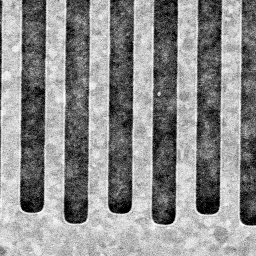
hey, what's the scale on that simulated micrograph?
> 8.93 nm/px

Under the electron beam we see groups of lines, slits or small figures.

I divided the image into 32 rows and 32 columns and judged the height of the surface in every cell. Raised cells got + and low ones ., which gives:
+++...++...+++...++...+++...++..
+++...++...+++...++...+++...++..
+++...++...+++...++...+++...++..
+++...++...+++...++...+++...++..
+++...++...+++...++...+++...++..
+++...++...+++...++...+++...++..
+++...++...+++...++...+++...++..
+++...++...+++...++...++....++..
+++...++...+++...++...++....++..
+++...++...++....++...++....++..
+++...++...++....++...++....++..
++....++...++....++...++....++..
++....++...++....++...++....++..
++....++...++....++...++....++..
++....++...++....++...++....++..
++....++...++....++...++....++..
++....++...++....++...++....++..
++....++...++....++...++....++..
++....++...++....++...++....++..
++....++...++....++...++....++..
++....++...++....++...++....++..
++....++...++....++...++....++..
++....++...++....++...++....++..
++....++...++....++...++....++..
++....++...++....++...++....++..
++....++...++....++...++....++..
+++..+++...+++..+++...+++..+++..
++++++++...++++++++...++++++++..
++++++++++++++++++++++++++++++++
++++++++++++++++++++++++++++++++
++++++++++++++++++++++++++++++++
++++++++++++++++++++++++++++++++